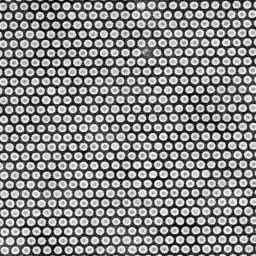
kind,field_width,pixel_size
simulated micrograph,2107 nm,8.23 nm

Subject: a regular array of raised bodies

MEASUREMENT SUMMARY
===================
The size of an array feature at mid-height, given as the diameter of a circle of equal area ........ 60.9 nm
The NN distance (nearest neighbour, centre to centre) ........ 85.4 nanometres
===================